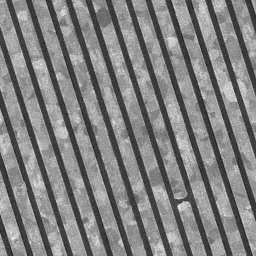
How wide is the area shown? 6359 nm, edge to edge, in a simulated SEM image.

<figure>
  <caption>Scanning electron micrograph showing parallel lines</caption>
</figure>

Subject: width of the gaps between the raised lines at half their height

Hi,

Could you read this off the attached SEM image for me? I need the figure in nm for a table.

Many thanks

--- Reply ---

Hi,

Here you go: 160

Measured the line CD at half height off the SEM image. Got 293 nm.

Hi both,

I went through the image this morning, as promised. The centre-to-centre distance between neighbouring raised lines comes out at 472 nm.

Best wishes